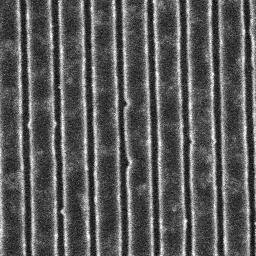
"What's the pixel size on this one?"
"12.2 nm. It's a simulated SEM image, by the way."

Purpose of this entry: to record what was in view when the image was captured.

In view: parallel lines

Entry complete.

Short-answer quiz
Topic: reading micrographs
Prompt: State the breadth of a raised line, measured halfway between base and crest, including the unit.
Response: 294 nm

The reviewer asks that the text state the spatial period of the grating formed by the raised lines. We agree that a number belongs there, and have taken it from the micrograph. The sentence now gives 390 nm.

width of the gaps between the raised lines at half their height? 97.6 nm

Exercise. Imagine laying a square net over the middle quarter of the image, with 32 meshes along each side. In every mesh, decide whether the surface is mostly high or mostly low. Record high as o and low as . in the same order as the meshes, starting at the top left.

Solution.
ooooo..oooooo..oooooo..oooooo..o
ooooo..oooooo..oooooo..oooooo..o
ooooo..oooooo..oooooo..oooooo..o
ooooo..oooooo..oooooo..oooooo..o
ooooo..oooooo..oooooo..oooooo..o
ooooo..oooooo..oooooo..oooooo..o
ooooo..oooooo..oooooo..oooooo..o
ooooo..oooooo..oooooo..oooooo...
ooooo..oooooo..oooooo..oooooo..o
ooooo..oooooo...ooooo...ooooo..o
ooooo..oooooo...ooooo..oooooo..o
ooooo..oooooo..oooooo...ooooo..o
ooooo...ooooo..oooooo..oooooo..o
ooooo...ooooo..oooooo...ooooo..o
ooooo...ooooo..oooooo...ooooo...
ooooo...ooooo..oooooo..ooooooo..
ooooo...ooooo..oooooo...ooooo...
ooooo...ooooo..oooooo...oooooo..
ooooo...oooooo.ooooooo..oooooo..
ooooo...oooooo..oooooo..oooooo..
ooooo...oooooo..ooooo...oooooo..
ooooo...oooooo..ooooo...ooooo...
oooooo..oooooo..ooooo...oooooo..
oooooo..oooooo..ooooo...ooooo...
oooooo..oooooo..ooooo...oooooo..
oooooo..oooooo..oooooo..oooooo..
oooooo..oooooo..oooooo..oooooo..
oooooo..oooooo..oooooo..oooooo..
oooooo..oooooo..oooooo..oooooo..
oooooo..oooooo..oooooo..oooooo..
oooooo..oooooo..oooooo..oooooo..
oooooo..oooooo..oooooo..oooooo..